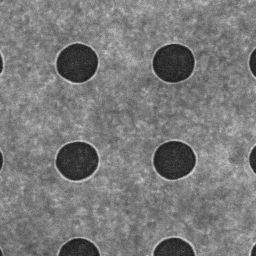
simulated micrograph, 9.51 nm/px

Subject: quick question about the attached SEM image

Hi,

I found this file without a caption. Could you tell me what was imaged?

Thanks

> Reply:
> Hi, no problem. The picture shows holes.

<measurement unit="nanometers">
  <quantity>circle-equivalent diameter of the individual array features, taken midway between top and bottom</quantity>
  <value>390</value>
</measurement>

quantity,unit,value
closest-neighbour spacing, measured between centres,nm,921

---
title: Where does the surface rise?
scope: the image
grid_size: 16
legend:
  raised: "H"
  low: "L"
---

HHHHHHHHHHHHHHHH
HHHHHHHHHHHHHHHH
HHHHHHHHHHHHHHHH
HHHHLLHHHHLLHHHH
HHHHLLHHHHLLHHHH
HHHHHHHHHHHHHHHH
HHHHHHHHHHHHHHHH
HHHHHHHHHHHHHHHH
HHHHHHHHHHHHHHHH
HHHHLLHHHHLLHHHH
HHHHLLHHHHLLHHHH
HHHHHHHHHHHHHHHH
HHHHHHHHHHHHHHHH
HHHHHHHHHHHHHHHH
HHHHHHHHHHHHHHHH
HHHHLLHHHHLLHHHH